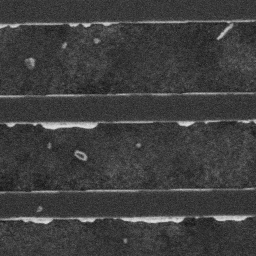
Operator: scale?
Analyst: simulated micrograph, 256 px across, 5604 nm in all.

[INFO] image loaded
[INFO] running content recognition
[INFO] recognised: lines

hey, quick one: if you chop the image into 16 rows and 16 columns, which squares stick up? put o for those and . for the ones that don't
oooooooooooooooo
oooo............
................
................
................
................
oooooooooooooooo
oooooooooooooooo
................
................
................
................
oooooooooooooooo
oooooooooooooooo
................
................